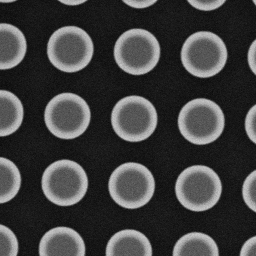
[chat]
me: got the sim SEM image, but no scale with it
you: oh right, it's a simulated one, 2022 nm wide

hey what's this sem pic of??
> an array of small figures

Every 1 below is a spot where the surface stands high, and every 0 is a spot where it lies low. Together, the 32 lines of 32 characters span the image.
00000000110000001110000011110000
00000000000000000000000000000000
00000000000000000000000000000000
11000000110000000000000000000000
11100011111000011110000011100000
11100011111100111111000111110001
11100011111100111111000111110001
11100011111000111111000111110001
10000001110000011110000111110001
00000000000000000000000011000000
00000000000000000000000000000000
10000000000000000000000000000000
11000011110000011100000011000000
11100011111000111110000111100001
11100011111000111111001111110001
11100011111000111111001111110001
11000011110000111110000111110001
00000000000000001100000111100001
00000000000000000000000000000000
00000000000000000000000000000000
11000011110000011100000000000000
11000011111000111110000111100000
11100111111000111110001111100001
11000111111000111110001111110011
11000011110000111110001111110011
00000001100000011100000111100001
00000000000000000000000000000000
00000000000000000000000000000000
10000001100000000000000000000000
11000111110000111100000111000000
11000111110001111110001111100001
11000111111001111110001111100011